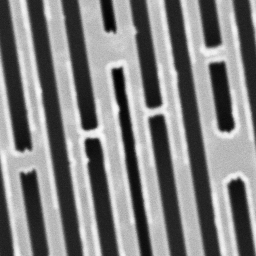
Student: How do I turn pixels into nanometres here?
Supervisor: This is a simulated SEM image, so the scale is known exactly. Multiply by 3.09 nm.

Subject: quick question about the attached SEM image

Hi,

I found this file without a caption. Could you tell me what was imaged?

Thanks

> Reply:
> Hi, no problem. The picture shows parallel lines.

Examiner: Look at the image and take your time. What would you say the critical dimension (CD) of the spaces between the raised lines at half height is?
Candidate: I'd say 51.1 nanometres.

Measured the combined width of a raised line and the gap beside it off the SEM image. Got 105 nanometres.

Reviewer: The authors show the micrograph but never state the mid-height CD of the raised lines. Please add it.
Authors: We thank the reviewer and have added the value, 53.7 nanometres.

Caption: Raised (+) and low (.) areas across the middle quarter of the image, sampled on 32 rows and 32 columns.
++....+++++++++++++....++++.....
++.....+++++...++++....+++++....
++.....+++++...++++.....++++....
++.....+++++...++++.....++++....
++.....+++++...++++.....++++....
+++....+++++....++++....++++....
+++....+++++...+++++....++++....
+++....++++++...++++....++++....
+++.....+++++...++++.....++++...
+++.....+++++...++++.....++++...
+++.....+++++...+++++...+++++...
++++....++++++..+++++++++++++...
++++....++++++...++++++++++++...
++++....++++++...++++....+++++..
++++.....+++++...++++.....++++..
++++.....+++++...++++.....++++..
+++++...++++++...++++.....++++..
++++++++++++++...++++.....++++..
+++++....+++++....++++....++++..
.++++....++++++...++++....++++..
.++++.....+++++...++++.....++++.
.++++.....+++++...++++.....++++.
.++++.....+++++...++++.....++++.
.+++++....+++++...++++.....++++.
..++++....+++++....++++....++++.
..++++....+++++....++++....++++.
..++++....++++++...++++....+++++
..++++.....+++++...++++.....++++
..++++.....+++++...++++.....++++
..++++.....+++++...++++.....++++
..+++++....+++++....++++....++++
..+++++....+++++....++++....++++